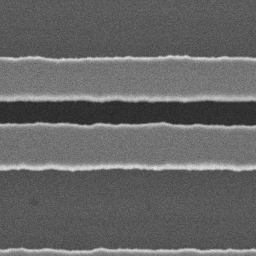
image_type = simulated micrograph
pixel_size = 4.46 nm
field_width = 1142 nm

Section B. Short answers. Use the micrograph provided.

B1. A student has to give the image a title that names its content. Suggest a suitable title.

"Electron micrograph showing lines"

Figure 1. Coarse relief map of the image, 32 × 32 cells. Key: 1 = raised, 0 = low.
00000000000000000000000000000000
00000000000000000000000000000000
00000000000000000000000000000000
00000000000000000000000000000000
00000000000000000000000000000000
00000000000000000000000000000000
00000000000000000000000000000000
11111111111111111111111111111111
11111111111111111111111111111111
11111111111111111111111111111111
11111111111111111111111111111111
11111111111111111111111111111111
11111111111111111111111111111111
00000000000000000000000000000000
00000000000000000000000000000000
01011111100011010011100000000000
11111111111111111111111111111111
11111111111111111111111111111111
11111111111111111111111111111111
11111111111111111111111111111111
11111111111111111111111111111111
00000000000000000000000000000000
00000000000000000000000000000000
00000000000000000000000000000000
00000000000000000000000000000000
00000000000000000000000000000000
00000000000000000000000000000000
00000000000000000000000000000000
00000000000000000000000000000000
00000000000000000000000000000000
00000000000000000000000000000000
11111111111111111111111111111111